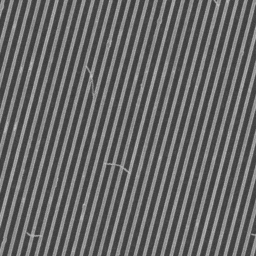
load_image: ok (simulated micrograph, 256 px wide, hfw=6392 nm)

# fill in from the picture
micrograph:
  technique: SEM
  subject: parallel lines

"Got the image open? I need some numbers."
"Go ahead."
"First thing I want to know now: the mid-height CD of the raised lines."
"81.6 nanometers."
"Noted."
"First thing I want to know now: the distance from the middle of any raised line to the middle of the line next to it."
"218 nm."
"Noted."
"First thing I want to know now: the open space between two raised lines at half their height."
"0.145 micrometres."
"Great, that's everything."